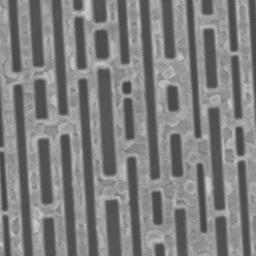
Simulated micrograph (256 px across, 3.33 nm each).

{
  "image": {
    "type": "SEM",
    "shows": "parallel lines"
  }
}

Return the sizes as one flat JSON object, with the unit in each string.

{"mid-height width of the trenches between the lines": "31.1 nm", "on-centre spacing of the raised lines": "0.0726 um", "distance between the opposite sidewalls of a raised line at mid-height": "39.8 nm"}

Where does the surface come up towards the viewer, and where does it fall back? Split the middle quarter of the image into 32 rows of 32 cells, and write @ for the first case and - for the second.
-@@---@@@@@@@@@@@@@@--@@@@@@@@@-
-@@@@@@@---@@@@@@@@@--@@@@@@@@@@
@@@@@@@@----@@@@@@@@---@@@@@@@@@
-@@@@@@@----@@@@@@@@---@@@@@@@@@
-@@---@@----@@@@@@@@---@@@@@@@@@
-@@---@@----@@@--@@@---@@@--@@@@
-@@@--@@----@@@--@@@---@@@---@@@
-@@@--@@@---@@@-@@@@---@@@---@@@
-@@@--@@@---@@@-@@@@---@@@---@@@
-@@@--@@@---@@@--@@@---@@@---@@@
-@@@--@@@---@@@--@@@---@@@---@@@
-@@@--@@@---@@@--@@@@--@@@--@@@@
-@@@--@@@---@@@--@@@@--@@@@@@@@@
@@@@---@@---@@@--@@@@--@@@@@@@@@
@@@@---@@---@@@---@@@--@@@@@@@@@
@@@@---@@---@@@---@@@--@@@@@@@@@
@@@@---@@---@@@---@@@--@@@@@@@@@
@@@@---@@----@@---@@@--@@@@--@@@
-@@@---@@----@@@--@@@---@@---@@@
--@@---@@----@@@@@@@@--@@@---@@@
--@@---@@----@@@@@@@@--@@@---@@@
--@@---@@----@@@@@@@@---@@@---@@
--@@@--@@----@@@@@@@@---@@@---@@
--@@@--@@@---@@@--@@@---@@@---@@
--@@@--@@@---@@@--@@@---@@@---@@
--@@@--@@@---@@@--@@@---@@@---@@
--@@@--@@@---@@@--@@@---@@@---@@
--@@@--@@@---@@@--@@@@--@@@---@@
--@@@--@@@@@@@@@--@@@@--@@@@@@@@
--@@@---@@@@@@@@--@@@@@@@@@@@@@@
--@@@---@@@@@@@@---@@@@@@@@@@@@@
--@@@---@@@@@@@@---@@@@@@@@@@@@@